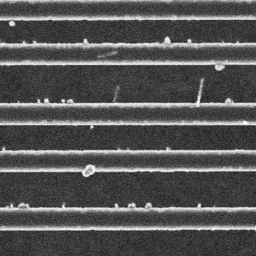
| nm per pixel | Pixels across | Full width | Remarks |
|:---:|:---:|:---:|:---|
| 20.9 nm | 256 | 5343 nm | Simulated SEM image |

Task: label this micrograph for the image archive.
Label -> lines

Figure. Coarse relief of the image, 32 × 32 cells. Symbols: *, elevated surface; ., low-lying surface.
********************************
********************************
................................
................................
................................
..........*.........**..........
********************************
********************************
................................
................................
................................
................................
................................
********************************
********************************
...*.******...*...*.......*...*.
................................
................................
................................
********************************
********************************
..........**....................
................................
................................
................................
................................
********************************
********************************
********************************
................................
................................
................................